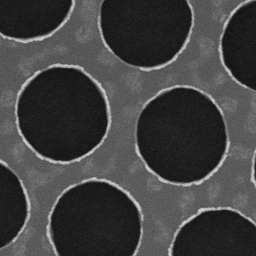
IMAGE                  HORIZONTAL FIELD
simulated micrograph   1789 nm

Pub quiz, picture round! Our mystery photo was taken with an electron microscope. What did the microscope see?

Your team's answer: holes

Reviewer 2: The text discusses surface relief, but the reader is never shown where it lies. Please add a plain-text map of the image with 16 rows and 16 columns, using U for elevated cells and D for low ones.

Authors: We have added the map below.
DDDDUUDDDDDDUUUD
DDDDUUDDDDDDUUDD
UUUUUUUDDDDDUUDD
UUUUUUUDDDDUUUDD
UUUDDUUUUUUUUUDD
UUDDDDUUUUUUUUUU
UDDDDDDUUDDDDUUU
UDDDDDDUUDDDDDUU
UDDDDDUUUDDDDDUU
UUDDDDUUUDDDDDUU
UUUUUUUUUDDDDUUU
DUUUUDDUUUUUUUUU
DDUUDDDDUUUUUUUU
DDUDDDDDDUUUDDDU
DUUDDDDDDUUDDDDD
UUUDDDDDDUUDDDDD